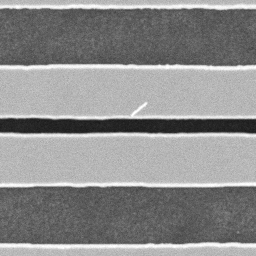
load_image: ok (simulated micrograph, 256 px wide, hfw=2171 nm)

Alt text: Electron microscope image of lines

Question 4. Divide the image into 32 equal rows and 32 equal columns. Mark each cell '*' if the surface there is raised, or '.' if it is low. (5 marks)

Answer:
********************************
................................
................................
................................
................................
................................
................................
................................
********************************
********************************
********************************
********************************
********************************
********************************
********************************
................................
................................
********************************
********************************
********************************
********************************
********************************
********************************
................................
................................
................................
................................
................................
................................
................................
****...................*********
********************************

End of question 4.